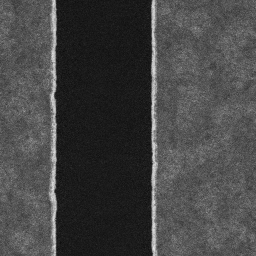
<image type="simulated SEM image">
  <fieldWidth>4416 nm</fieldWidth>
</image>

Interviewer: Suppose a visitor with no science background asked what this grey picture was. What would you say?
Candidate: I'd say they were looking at one or a few lines or trenches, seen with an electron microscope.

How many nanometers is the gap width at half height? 1720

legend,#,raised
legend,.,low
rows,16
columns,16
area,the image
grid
###.......######
###.......######
###.......######
###.......######
###.......######
###.......######
###.......######
###.......######
###.......######
###.......######
###.......######
###.......######
###.......######
###.......######
###.......######
###.......######